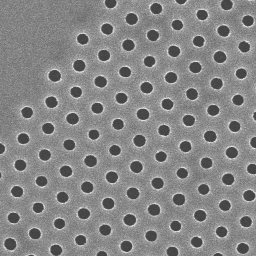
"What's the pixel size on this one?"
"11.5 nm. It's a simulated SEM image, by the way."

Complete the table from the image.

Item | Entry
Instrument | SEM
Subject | a regular array of holes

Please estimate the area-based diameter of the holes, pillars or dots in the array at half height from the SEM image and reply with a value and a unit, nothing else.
135 nm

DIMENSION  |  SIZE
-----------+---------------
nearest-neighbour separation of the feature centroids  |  303 nanometres